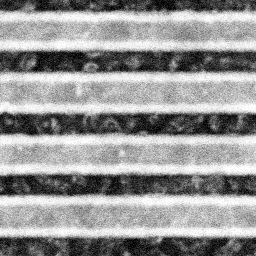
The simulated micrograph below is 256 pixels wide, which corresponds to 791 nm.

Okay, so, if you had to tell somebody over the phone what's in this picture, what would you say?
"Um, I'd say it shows one or a few lines or trenches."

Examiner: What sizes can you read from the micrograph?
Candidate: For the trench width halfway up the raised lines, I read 99.3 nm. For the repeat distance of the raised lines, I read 0.191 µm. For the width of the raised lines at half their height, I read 91.2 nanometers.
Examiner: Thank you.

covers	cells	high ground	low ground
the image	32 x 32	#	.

................................
................................
################################
################################
################################
################################
................................
................................
................................
................................
################################
################################
################################
................................
................................
................................
................................
................................
################################
################################
################################
................................
................................
................................
................................
################################
################################
################################
################################
................................
................................
................................